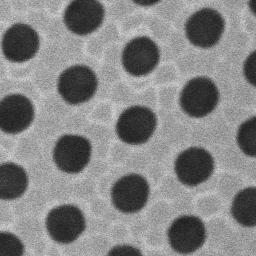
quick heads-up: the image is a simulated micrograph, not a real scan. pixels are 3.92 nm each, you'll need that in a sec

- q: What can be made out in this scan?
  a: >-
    a regular array of holes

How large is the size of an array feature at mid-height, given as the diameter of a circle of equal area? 151 nanometers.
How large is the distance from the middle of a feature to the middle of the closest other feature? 0.27 microns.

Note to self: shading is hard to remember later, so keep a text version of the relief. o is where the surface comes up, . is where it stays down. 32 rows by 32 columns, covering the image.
ooooooooo....oooo..oooooooooooo.
oooooooo.....oooooooooooo..ooooo
oooooooo.....oooooooooo.....oooo
o...oooo....ooooooooooo.....oooo
.....oooooooooooooooooo.....oooo
.....ooooooooooo...ooooo...ooooo
.....oooooooooo.....oooooooooooo
o..oooooooooooo.....ooooooooooo.
ooooooooo..ooooo...ooooooooooo..
ooooooo.....ooooooooooooooooooo.
ooooooo.....ooooooooooo....oooo.
ooooooo.....ooooooooooo....ooooo
....oooo...oooooooooooo....ooooo
....oooooooooooo..ooooo....ooooo
....ooooooooooo....ooooo.ooooooo
....ooooooooooo....ooooooooooo..
o..oooooooooooo....ooooooooooo..
ooooooo....oooo...oooooooooooo..
ooooooo....ooooooooooooo.ooooo..
ooooooo....ooooooooooo....ooooo.
o.ooooo....ooooooooooo.....ooooo
...ooooo..oooooooooooo....oooooo
...oooooooooooo...oooo....oooooo
...ooooooooooo.....oooooooooooo.
...ooooooooooo.....oooooooooo...
oooooooooooooo....ooooooooooo...
oooooo....ooooo..oooooooooooo...
oooooo.....ooooooooooo...oooo...
oooooo.....oooooooooo.....oooooo
..oooo....ooooooooooo.....oooooo
...oooooooooooooooooo....ooooooo
...ooooooooooo...ooooo..oooooooo